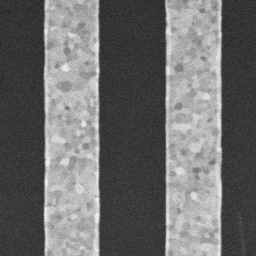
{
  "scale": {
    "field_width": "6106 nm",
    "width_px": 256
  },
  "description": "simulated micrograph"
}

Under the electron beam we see wiring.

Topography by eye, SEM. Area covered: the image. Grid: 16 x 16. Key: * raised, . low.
...***....****..
...***.....***..
...***.....***..
...***.....***..
...***.....***..
...***.....***..
...***.....***..
...***....****..
...***....****..
...***....****..
...***.....***..
...***.....***..
...***.....***..
...***.....***..
...***.....***..
...***....****..